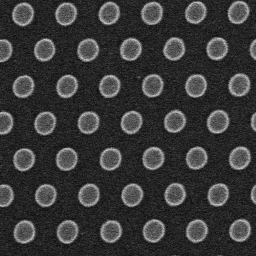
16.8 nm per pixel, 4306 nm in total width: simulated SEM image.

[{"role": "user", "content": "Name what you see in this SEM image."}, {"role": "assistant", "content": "a regular array of raised bodies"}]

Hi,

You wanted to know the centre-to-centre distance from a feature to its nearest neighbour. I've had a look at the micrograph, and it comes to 0.704 um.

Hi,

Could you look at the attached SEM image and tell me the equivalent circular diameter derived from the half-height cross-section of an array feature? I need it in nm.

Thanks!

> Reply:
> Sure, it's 364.